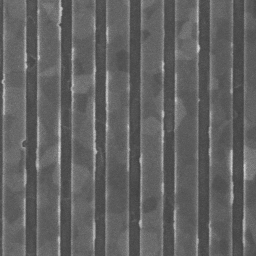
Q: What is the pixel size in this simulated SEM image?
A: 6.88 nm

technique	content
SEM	parallel lines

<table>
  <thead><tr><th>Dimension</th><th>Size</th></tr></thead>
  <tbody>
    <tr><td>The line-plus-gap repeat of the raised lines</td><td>237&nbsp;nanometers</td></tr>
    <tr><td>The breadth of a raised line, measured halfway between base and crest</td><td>0.157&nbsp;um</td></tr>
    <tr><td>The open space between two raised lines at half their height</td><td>78.3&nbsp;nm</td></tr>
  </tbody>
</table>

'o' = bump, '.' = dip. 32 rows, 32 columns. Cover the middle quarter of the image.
..oooooo...ooooo...oooooo...oooo
..oooooo...ooooo...oooooo...oooo
..oooooo...ooooo...oooooo...oooo
..oooooo...ooooo...oooooo...oooo
..oooooo...ooooo...oooooo...oooo
..oooooo...ooooo...oooooo...oooo
..oooooo...ooooo...oooooo...oooo
..oooooo...ooooo...oooooo...oooo
..oooooo...ooooo...oooooo...oooo
..oooooo...ooooo...oooooo...oooo
..oooooo...ooooo...oooooo...oooo
..oooooo...ooooo...oooooo...oooo
..oooooo...ooooo...oooooo...oooo
..oooooo...ooooo...oooooo...oooo
..oooooo...ooooo...oooooo...oooo
..oooooo...ooooo...oooooo...oooo
..oooooo...ooooo...oooooo...oooo
..oooooo...ooooo...oooooo...oooo
..oooooo...ooooo...oooooo...oooo
..oooooo...ooooo...oooooo...oooo
..oooooo...ooooo...oooooo...oooo
..oooooo...ooooo...oooooo...oooo
..oooooo...ooooo...oooooo...oooo
..oooooo...ooooo...oooooo...oooo
..oooooo...ooooo...oooooo...oooo
..oooooo..oooooo...oooooo...oooo
..oooooo..oooooo...oooooo...oooo
..oooooo...ooooo...oooooo...oooo
..oooooo...ooooo...oooooo...oooo
..oooooo...ooooo...oooooo...oooo
..oooooo...ooooo...oooooo...oooo
..oooooo...ooooo...oooooo...oooo